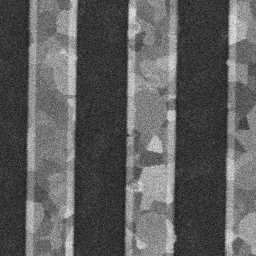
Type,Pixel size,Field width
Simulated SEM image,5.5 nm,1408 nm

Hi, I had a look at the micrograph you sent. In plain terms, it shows one or a few lines or trenches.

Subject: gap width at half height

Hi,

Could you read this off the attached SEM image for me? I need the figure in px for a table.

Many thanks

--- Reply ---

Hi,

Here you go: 59.1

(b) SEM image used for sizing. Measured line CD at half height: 0.225 micrometres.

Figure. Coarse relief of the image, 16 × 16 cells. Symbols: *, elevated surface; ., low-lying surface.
..***...***....*
..***...***....*
..***...***....*
..***...***...**
..**....***...**
..***...***...**
..***...***...**
..**....***...**
..**....***...**
..**....***...**
..**....***...**
..**....***...**
..**....***...**
..**....***...**
..**....***...**
..**....***...**